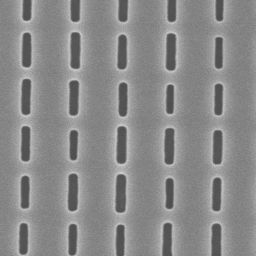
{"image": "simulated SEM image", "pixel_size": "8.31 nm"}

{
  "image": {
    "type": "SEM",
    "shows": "a regular array of holes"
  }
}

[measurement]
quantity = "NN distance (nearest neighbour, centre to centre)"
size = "0.39 µm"